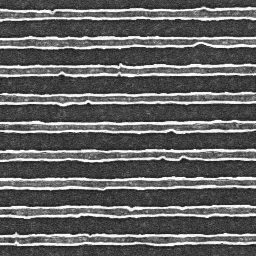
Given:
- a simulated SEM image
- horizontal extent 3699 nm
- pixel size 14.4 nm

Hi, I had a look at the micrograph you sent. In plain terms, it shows parallel lines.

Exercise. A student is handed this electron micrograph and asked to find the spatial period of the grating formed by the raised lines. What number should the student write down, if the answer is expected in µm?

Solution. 0.407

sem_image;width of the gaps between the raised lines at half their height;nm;278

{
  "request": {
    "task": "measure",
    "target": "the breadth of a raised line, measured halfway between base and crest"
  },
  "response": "126 nm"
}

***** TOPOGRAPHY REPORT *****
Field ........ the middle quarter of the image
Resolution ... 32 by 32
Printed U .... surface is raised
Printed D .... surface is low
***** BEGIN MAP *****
DDDDDDDDDDDDDDUDDDDDDDDUDDDDDDDD
UUUUUUUUUUUUUUUUUUUUUUUUUUUUUUUU
UUUUUUUUUUUUUUUUUUUUUUUUUUUUUUUU
DDDDDDDDDDDDDDDDDDDDDDDDDDDDDDDD
DDDDDDDDDDDDDDDDDDDDDDDDDDDDDDDD
DDDDDDDDDDDDDDDDDDDDDDDDDDDDDDDD
DDDDDDDDDDDDDDDDDDDDDDDDDDDDDDDD
DDDDDDDDDDDDDDDDDDDDDDDDDDDDDDDD
UUUUUUUUUUUUUUUUUUUUUUUUUUUUUUUU
UUUUUUUUUUUUUUUUUUUUUUUUUUDUUUUU
DDDDDDDDDDDDDDDDDDDDDDDDDDDDDDDD
DDDDDDDDDDDDDDDDDDDDDDDDDDDDDDDD
DDDDDDDDDDDDDDDDDDDDDDDDDDDDDDDD
DDDDDDDDDDDDDDDDDDDDDDDDDDDDDDDD
DDDDDDDDDDDDDDDDDDDDDDDDDDDDDDDD
UUUUUUUUUUUUUUUUUUUUUUUUUUUUUUUU
UUUUUUUUUUUUUUUUUUUUUUUUUUUUUUUU
DDDDDDDDDDDDDDDDDDDDDDDDDDDDDDDD
DDDDDDDDDDDDDDDDDDDDDDDDDDDDDDDD
DDDDDDDDDDDDDDDDDDDDDDDDDDDDDDDD
DDDDDDDDDDDDDDDDDDDDDDDDDDDDDDDD
DDDDDDDDDDDDDDDDDDDDDDDDDDDDDDDD
UUUUUUUUUUUUUUUUUUUUUUUUUUUUUUUU
UUUUUUUUUUUUUUUUUUUUUUUUUUUUUDUU
DDDDDDDDDDDDDDDDDDDDDDDDDDDDDDDD
DDDDDDDDDDDDDDDDDDDDDDDDDDDDDDDD
DDDDDDDDDDDDDDDDDDDDDDDDDDDDDDDD
DDDDDDDDDDDDDDDDDDDDDDDDDDDDDDDD
DDDDDDDDDDDDDDDDDDDDDDDDDDDUDDDD
UUUUUUUUUUUUUUUUUUUUUUUUUUUUUUUU
UUUUUUUUUUUUUUUUUUUUUUUUUUUUUUUU
DDDDDDDDDDDDDDDDDDDDDDDDDDDDDDDD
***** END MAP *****